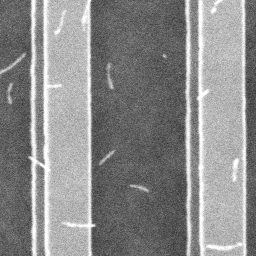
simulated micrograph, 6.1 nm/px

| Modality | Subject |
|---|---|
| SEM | lines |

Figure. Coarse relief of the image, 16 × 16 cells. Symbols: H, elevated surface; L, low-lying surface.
LLHHHHLLLLLLHHHL
LLHHHHLLLLLLHHHL
LLHHHHLLLLLLHHHL
LLHHHHLLLLLLHHHL
LLHHHHLLLLLLHHHL
LLHHHHLLLLLLHHHL
LLHHHHLLLLLLHHHL
LLHHHHLLLLLLHHHL
LLHHHHLLLLLLHHHL
LLHHHHLLLLLLHHHL
LLHHHHLLLLLLHHHL
LLHHHHLLLLLLHHHL
LLHHHHLLLLLLHHHL
LLHHHHLLLLLLHHHL
LLHHHHLLLLLLHHHL
LLHHHHLLLLLLHHHL